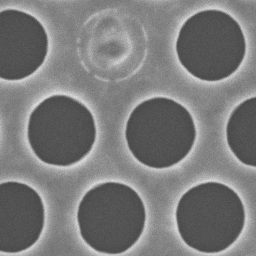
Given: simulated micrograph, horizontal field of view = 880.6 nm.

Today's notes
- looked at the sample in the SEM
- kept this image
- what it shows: holes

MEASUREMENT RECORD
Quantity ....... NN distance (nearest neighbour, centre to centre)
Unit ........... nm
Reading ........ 338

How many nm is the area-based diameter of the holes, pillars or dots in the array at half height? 240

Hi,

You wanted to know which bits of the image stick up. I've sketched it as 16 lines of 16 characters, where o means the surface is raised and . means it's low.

oooooooooooooooo
...ooooooooo...o
...oooooooo....o
...oooooooo....o
..oooooooooo...o
oooooooooooooooo
ooo..oooo..oooo.
oo....oo....oo..
oo....oo....oo..
oo....oo....ooo.
oooooooooooooooo
.ooooo..ooooo.oo
...oo....oo....o
...oo....oo....o
...oo....oo....o
..oooo..oooo..oo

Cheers